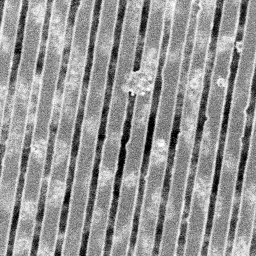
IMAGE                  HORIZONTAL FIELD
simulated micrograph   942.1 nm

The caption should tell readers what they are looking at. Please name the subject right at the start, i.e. parallel lines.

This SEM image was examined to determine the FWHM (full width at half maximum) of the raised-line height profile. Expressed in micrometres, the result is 0.0613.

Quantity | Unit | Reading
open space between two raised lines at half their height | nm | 29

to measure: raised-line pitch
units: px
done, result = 24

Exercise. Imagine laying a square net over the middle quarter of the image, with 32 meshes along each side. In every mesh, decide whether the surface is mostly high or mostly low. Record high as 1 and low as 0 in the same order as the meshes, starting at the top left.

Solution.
01111001111001111001111001111001
01111001111001111001111001111001
01111001111001111111111011111001
01111001111001111111111001111001
11111011111001111111110001111001
11110011110011111111110011111001
11110011110011111111110001110001
11110011110011110011110011110011
11110011110011110011110011110011
11110011110011110011110011110011
11110111110011110011110011110011
11100111100111100111100111110011
11100111100111100111100111100011
11100111100111100111100111100111
11100111100111100111100111100111
11101111100111100111100111100111
11001111100111100111100111100111
11001111000111000111000111100111
11001111001111001111001111000111
11001111001111001111001111001111
11001111001111001111001111001111
11001111001111001111001111001111
11001111011111001111001111001111
10011110011110001111001111001111
10011110011110011110011110001110
10011110011110011110011110011110
10011110011110011110011110011110
10011110011110011110011110011110
10011110011110011110111110011110
10111100011100011110111110011110
00111100111100111110111110011110
00111100111100111100111100111100